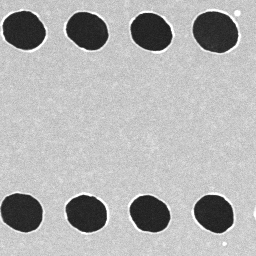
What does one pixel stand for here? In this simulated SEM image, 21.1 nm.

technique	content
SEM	holes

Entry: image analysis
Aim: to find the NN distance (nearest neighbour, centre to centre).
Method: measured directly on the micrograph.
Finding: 1340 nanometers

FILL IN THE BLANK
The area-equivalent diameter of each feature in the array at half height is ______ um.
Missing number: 0.844